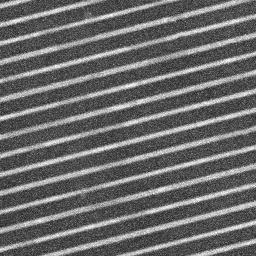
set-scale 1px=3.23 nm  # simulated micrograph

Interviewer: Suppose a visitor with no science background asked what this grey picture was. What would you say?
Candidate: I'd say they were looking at parallel lines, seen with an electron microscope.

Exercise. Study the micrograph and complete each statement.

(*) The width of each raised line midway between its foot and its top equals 9.8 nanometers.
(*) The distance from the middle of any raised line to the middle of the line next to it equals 58.6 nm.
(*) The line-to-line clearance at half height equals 47.6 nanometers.